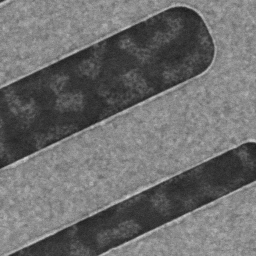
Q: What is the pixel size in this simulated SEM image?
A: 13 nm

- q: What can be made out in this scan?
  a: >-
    one or a few lines or trenches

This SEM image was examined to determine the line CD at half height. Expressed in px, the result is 80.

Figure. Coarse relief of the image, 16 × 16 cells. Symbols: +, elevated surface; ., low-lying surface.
+++++++++++.++++
++++++++.....+++
++++++.......+++
++++.........+++
++...........+++
...........+++++
.........+++++++
.......+++++++++
....++++++++++++
..++++++++++++..
++++++++++++....
++++++++++......
++++++++......++
++++++.....+++++
+++......+++++++
+......+++++++++